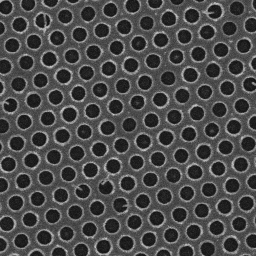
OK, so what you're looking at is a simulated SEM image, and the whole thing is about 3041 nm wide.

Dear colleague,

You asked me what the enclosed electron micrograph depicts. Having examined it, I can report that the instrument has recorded a regular array of holes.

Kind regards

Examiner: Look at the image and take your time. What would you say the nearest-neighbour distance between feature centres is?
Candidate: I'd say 262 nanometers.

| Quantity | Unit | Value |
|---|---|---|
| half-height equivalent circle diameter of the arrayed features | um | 0.171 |